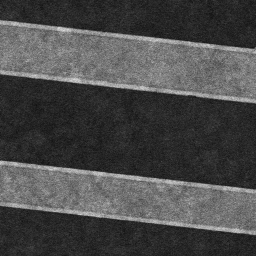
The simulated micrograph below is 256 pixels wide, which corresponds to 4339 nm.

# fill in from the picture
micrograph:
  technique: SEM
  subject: one or a few lines or trenches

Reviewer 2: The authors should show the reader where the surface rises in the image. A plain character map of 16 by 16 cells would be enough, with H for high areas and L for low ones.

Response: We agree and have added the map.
LLLLLLLLLLLLLLLL
HLLLLLLLLLLLLLLL
HHHHHHHHHHLLLLLL
HHHHHHHHHHHHHHHH
HHHHHHHHHHHHHHHH
LLLLLLLLLHHHHHHH
LLLLLLLLLLLLLLLL
LLLLLLLLLLLLLLLL
LLLLLLLLLLLLLLLL
LLLLLLLLLLLLLLLL
HHHLLLLLLLLLLLLL
HHHHHHHHHHHHLLLL
HHHHHHHHHHHHHHHH
LLLLLLHHHHHHHHHH
LLLLLLLLLLLLLLLH
LLLLLLLLLLLLLLLL